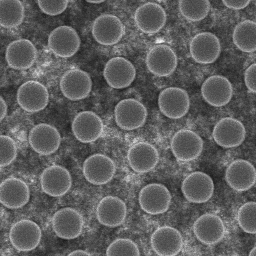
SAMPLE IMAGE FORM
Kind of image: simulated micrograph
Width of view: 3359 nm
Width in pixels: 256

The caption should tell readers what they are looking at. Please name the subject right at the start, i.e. a regular array of raised bodies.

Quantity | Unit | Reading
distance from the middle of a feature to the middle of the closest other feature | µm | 0.573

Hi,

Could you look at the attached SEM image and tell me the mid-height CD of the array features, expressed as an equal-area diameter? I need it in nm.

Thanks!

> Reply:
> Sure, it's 405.